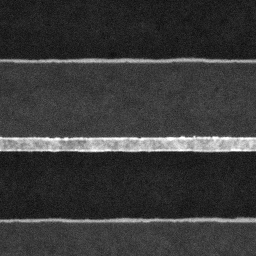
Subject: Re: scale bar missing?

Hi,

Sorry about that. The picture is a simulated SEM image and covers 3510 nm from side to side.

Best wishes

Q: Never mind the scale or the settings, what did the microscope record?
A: lines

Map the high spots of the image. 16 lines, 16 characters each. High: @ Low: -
----------------
----------------
----------------
----------------
@@@@@@@@@@@@@@@@
@@@@@@@@@@@@@@@@
@@@@@@@@@@@@@@@@
@@@@@@@@@@@@@@@@
@@@@@@@@@@@@@@@@
----------------
----------------
----------------
----------------
----------------
@@@@@@@@@@@@@@@@
@@@@@@@@@@@@@@@@